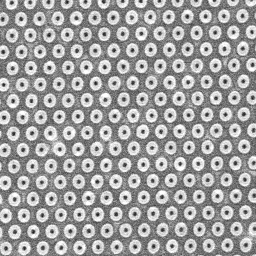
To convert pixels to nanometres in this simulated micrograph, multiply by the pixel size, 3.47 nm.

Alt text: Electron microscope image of a regular array of ring-shaped raised bodies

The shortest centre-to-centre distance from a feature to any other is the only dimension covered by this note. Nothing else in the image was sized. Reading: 63.6 nanometres